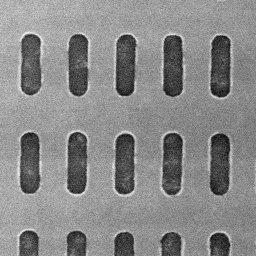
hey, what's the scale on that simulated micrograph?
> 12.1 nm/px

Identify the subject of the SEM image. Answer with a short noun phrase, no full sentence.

a regular array of holes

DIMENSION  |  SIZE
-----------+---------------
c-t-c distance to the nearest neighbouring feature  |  0.572 um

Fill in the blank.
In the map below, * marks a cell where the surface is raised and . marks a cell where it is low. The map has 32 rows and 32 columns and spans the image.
********************************
********************************
********************************
********************************
***..****.*****..****.*****.****
***..****..****..***...***...***
***..****..***...***...***...***
***..***...***...***...***...***
***..***...***...***...***...***
***..****..***...***...***...***
***..****..***...***...***...***
***..****..****..****..***...***
********************************
********************************
********************************
********************************
********************************
***..****..***...***...***...***
***..***...***...***...***...***
***..***...***...***...***...***
**...***...***...***...***...***
**...***...***...***...***...***
**...***...***...***...***...***
***..***...***...***...***...***
********************************
********************************
********************************
********************************
********************************
**...***...****..***..****..****
**...***...***...***...***...***
**...***...***...***...***...***